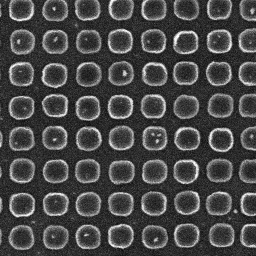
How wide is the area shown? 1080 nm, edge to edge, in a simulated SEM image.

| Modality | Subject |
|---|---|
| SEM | a regular array of raised bodies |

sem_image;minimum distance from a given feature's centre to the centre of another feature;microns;0.134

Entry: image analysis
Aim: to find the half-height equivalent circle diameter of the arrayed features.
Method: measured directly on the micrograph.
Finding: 105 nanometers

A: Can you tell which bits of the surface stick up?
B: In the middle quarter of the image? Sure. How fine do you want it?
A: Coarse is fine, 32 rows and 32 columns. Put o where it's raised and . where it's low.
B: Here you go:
....oooo....ooooo...ooooo...oooo
o..oooooo..oooooo...ooooo..ooooo
o..oooooo..oooooo...oooooo.ooooo
o..oooooo..oooooo...oooooo..oooo
...ooooo....oooo....ooooo...oooo
................................
................................
................................
o...oooo....oooo....oooo....oooo
o..oooooo..oooooo...ooooo...oooo
o..oooooo..oooooo..oooooo..ooooo
o..oooooo..oooooo..oooooo..ooooo
...oooooo..oooooo...ooooo...oooo
....oooo.....o...............oo.
................................
................................
....oooo....ooooo...ooooo....ooo
o..oooooo...ooooo...ooooo...oooo
o..oooooo...ooooo...oooooo..oooo
...oooooo...ooooo...oooooo..oooo
....ooooo...ooooo...ooooo...oooo
................................
................................
................................
....oooo.......o.....ooo....oooo
o..oooooo...ooooo...ooooo...oooo
o..oooooo...ooooo...oooooo..oooo
o..oooooo...ooooo...oooooo..oooo
o..ooooo....ooooo...ooooo...oooo
.....o.......o.o......oo.....ooo
................................
................................